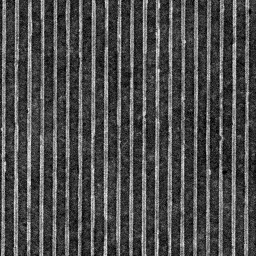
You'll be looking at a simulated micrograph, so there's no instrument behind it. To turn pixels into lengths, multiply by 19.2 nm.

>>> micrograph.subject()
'parallel lines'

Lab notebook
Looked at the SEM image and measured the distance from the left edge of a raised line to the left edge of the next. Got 245 nm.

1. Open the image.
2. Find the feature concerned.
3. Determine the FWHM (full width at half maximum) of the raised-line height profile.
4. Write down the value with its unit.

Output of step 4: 2.38 pixels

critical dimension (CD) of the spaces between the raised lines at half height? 197 nm